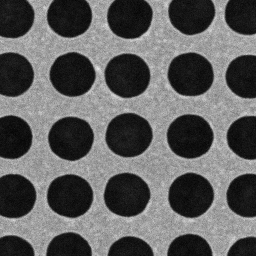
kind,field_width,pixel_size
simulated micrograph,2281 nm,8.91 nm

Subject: a regular array of holes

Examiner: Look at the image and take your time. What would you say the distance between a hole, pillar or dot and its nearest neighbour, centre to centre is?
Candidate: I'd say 510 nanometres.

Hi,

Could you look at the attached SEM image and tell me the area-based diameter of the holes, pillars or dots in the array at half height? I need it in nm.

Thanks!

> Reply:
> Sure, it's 402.